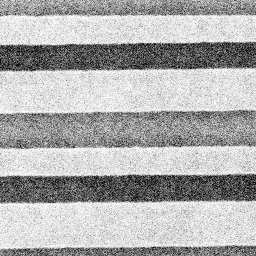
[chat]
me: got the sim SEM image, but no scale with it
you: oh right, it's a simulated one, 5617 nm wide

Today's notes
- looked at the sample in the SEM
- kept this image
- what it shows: lines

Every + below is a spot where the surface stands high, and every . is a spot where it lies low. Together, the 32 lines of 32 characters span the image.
................................
................................
++++++++++++++++++++++++++++++++
++++++++++++++++++++++++++++++++
++++++++++++++++++++++++++++++++
+++++++++.......................
................................
................................
................................
++++++++++++++++++++++++++++++++
++++++++++++++++++++++++++++++++
++++++++++++++++++++++++++++++++
++++++++++++++++++++++++++++++++
++++++++++++++++++++++++++++++++
................................
................................
................................
................................
.................+....+.++++++++
++++++++++++++++++++++++++++++++
++++++++++++++++++++++++++++++++
++++++++++++++++++++++++++++++++
................................
................................
................................
......++++++++++++++++++++++++++
++++++++++++++++++++++++++++++++
++++++++++++++++++++++++++++++++
++++++++++++++++++++++++++++++++
++++++++++++++++++++++++++++++++
++++++++++++++++++++++++++++++++
................................